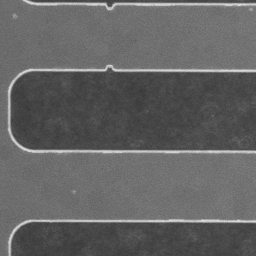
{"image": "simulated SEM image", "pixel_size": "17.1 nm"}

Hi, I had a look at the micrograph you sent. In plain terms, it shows one or a few lines or trenches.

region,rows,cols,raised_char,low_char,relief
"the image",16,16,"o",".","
oooooooooooooooo
oooooooooooooooo
oooooooooooooooo
oooooooooooooooo
oo..............
o...............
o...............
o...............
o...............
ooooooooooooo...
oooooooooooooooo
oooooooooooooooo
oooooooooooooooo
oooooooooooooooo
o...............
o...............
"